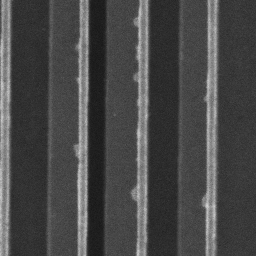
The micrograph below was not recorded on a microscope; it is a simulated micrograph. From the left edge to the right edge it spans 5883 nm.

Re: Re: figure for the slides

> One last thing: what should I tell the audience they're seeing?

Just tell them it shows lines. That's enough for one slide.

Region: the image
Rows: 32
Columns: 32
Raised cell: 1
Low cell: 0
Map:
10000001111001111100000111100000
10000001111001111100000111100000
10000001111001111100000111100000
10000001111001111100000111100000
10000011111001111100000111100000
10000011111001111100000111100000
10000011111001111100000111100000
10000011111001111100000111100000
10000011111001111100000111100000
10000011111001111100000111100000
10000011111001111100000111100000
10000011111001111100000111100000
10000011111001111100000111100000
10000011111001111100000111100000
10000011111001111100000111100000
10000011111001111100000111100000
10000011111001111100000111100000
10000011111001111100000111100000
10000011111001111100000111100000
10000011111001111100000111100000
10000011111001111100000111100000
10000011111001111100000111100000
10000011111001111100000111100000
10000011111001111100000111100000
10000011111001111100000111100000
10000011111001111100000111100000
10000011111001111100000111100000
10000011111001111100000111100000
10000011111001111100000111100000
10000011111001111100000111100000
10000011111001111100000111100000
10000011111001111100000111100000